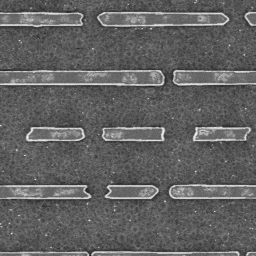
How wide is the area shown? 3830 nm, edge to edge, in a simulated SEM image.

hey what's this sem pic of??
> parallel lines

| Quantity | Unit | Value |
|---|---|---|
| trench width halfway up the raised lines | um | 0.679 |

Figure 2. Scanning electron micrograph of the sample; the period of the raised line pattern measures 861 nm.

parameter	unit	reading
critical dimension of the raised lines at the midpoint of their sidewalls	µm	0.195